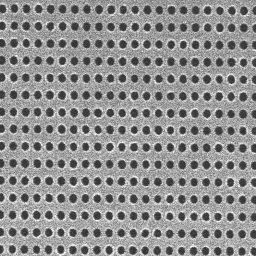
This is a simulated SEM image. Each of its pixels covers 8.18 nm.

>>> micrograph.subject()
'a regular array of holes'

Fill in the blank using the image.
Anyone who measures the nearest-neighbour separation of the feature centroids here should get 0.0971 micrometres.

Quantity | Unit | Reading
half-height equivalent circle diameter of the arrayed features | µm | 0.0672